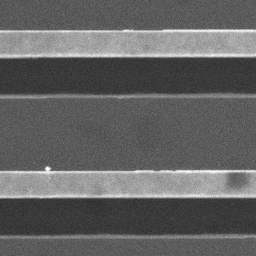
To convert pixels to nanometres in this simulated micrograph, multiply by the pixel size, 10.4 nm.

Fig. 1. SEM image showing lines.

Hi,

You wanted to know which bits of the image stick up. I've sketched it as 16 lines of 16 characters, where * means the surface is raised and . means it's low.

****************
****************
****************
****************
................
................
****************
****************
****************
****************
****************
****************
................
................
................
****************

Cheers